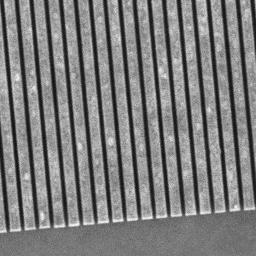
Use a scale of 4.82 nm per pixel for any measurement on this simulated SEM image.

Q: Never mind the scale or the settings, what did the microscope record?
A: parallel lines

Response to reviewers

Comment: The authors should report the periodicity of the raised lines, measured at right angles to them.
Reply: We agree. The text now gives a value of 70.6 nm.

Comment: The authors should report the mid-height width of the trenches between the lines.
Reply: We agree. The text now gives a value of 21.6 nm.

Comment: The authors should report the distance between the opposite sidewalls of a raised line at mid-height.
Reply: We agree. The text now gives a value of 47.3 nm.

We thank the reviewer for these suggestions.